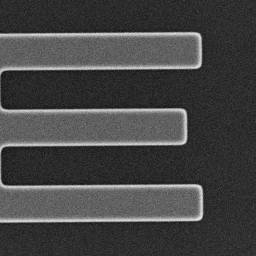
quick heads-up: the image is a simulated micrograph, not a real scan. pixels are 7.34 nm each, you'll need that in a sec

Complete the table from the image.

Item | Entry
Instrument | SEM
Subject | groups of lines, slits or small figures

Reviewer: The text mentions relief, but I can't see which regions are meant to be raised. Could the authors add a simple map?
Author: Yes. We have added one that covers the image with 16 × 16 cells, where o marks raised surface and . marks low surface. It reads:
................
................
ooooooooooooo...
ooooooooooooo...
................
................
................
oooooooooooo....
oooooooooooo....
................
................
................
ooooooooooooo...
oooooooooooo....
................
................